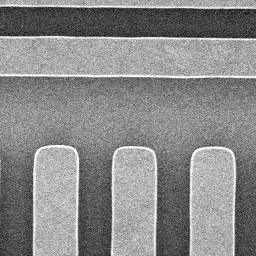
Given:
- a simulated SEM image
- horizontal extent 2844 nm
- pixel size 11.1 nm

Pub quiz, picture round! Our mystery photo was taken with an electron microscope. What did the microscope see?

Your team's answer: groups of lines, slits or small figures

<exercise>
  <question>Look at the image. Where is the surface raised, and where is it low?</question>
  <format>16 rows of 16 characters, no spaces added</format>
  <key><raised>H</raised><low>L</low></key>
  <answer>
LLLLLLLLLLLLHHHH
LLLLLLLLLLLLLLLL
HHHHHHHHHHHHHHHH
HHHHHHHHHHHHHHHH
HHHHHHHHHHHHHHHH
LLLLLLLLLLLLLLLL
LLLLLLLLLLLLLLLL
LLLLLLLLLLLLLLLL
LLLLLLLLLLLLLLLL
LLHHHLLHHHLLHHLL
LLHHHLLHHHLLHHHL
LLHHHLLHHHLLHHHL
LLHHHLLHHHLLHHHL
LLHHHLLHHHLLHHHL
LLHHHLLHHHLLHHHL
LLHHHLLHHHLLHHHL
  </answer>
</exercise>